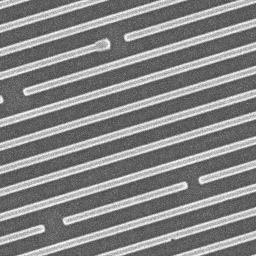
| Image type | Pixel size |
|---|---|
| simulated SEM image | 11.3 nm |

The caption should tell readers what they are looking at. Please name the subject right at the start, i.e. parallel lines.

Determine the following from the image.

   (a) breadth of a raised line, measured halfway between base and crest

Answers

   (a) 70.1 nm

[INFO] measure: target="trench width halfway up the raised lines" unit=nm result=182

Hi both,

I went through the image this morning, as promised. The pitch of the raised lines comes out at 254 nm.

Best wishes